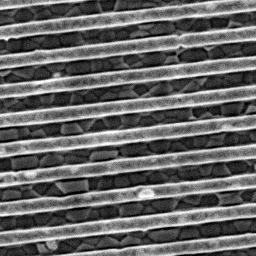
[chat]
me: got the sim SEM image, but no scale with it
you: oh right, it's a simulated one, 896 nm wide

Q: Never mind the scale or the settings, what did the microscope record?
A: parallel lines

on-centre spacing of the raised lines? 103 nanometres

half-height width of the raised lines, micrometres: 0.0439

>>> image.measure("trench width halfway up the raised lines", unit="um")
0.0583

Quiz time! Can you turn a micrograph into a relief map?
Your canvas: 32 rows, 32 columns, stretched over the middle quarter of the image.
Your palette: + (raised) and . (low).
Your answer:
...........................+++++
..................++++++++++++++
........++++++++++++++++++++++++
.++++++++++++++++++++++++++++...
++++++++++++++++++..............
+++++++++.......................
+...............................
................................
.......................+++++++++
.............+++++++++++++++++++
....++++++++++++++++++++++++++..
+++++++++++++++++++++...........
+++++++++++++...................
++++++..........................
................................
.........................+++++++
................+.++++++++++++++
.......+++++++++++++++++++++++++
++++++++++++++++++++++++.+......
+++++++++++++++++...............
+++++++.........................
................................
............................++++
...................+++++++++++++
..........++++++++++++++++++++++
.++++++++++++++++++++++++++.....
+++++++++++++++++++.............
++++++++++......................
+++.............................
.++++...........................
+++++.................++++++++++
+++++........+++++++++++++++++++